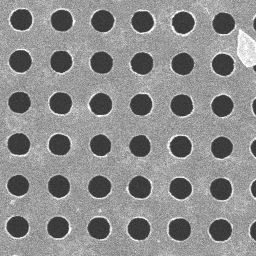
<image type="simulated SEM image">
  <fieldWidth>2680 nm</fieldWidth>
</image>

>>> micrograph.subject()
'a regular array of holes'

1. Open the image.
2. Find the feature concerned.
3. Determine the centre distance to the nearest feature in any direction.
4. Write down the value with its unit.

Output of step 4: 424 nm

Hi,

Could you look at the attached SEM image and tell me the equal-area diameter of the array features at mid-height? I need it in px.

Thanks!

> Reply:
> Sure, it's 22.6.